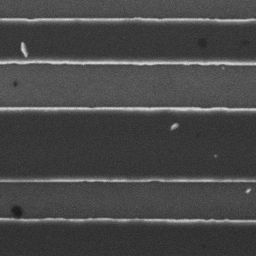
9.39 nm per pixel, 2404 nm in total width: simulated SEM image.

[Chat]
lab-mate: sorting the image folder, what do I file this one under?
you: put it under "lines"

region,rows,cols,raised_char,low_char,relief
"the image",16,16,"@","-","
----------------
@@@@@@@@@@@@@@@@
@@@@@@@@@@@@@@@@
@@@@@@@@@@@@@@@@
----------------
----------------
----------------
@@@@@@@@@@@@@@@@
@@@@@@@@@@@@@@@@
@@@@@@@@@@@@@@@@
@@@@@@@@@@@@@@@@
----------------
----------------
----------------
@@@@@@@@@@@@@@@@
@@@@@@@@@@@@@@@@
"